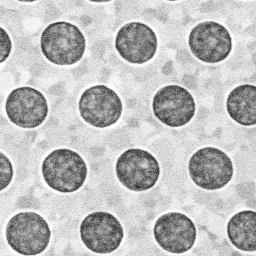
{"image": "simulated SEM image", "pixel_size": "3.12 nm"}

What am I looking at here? a regular array of holes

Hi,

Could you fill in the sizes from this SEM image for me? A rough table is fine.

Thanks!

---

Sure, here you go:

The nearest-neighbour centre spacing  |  228 nm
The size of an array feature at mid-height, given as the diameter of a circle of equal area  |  0.139 µm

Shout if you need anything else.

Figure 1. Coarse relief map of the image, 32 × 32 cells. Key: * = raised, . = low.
********************************
********************************
********************************
******....*****....*****....****
.****......***......****.....***
..***......***......****.....***
.****......****.....****.....***
.*****....*****....******...****
********************************
********************************
******************************.*
*....*****....******....*****...
*.....****.....****.....****....
*.....****.....****.....****....
*.....****.....****.....*****...
**...******...******...*******..
********************************
********************************
*************************..*****
.*****....*****....*****.....***
..***......***......****.....***
..***......***......****.....***
.****......****.....****.....***
.*****....******...******...****
********************************
********************************
**..********.********.********..
*.....****.....*****....*****...
*.....****.....****......***....
*.....****.....****......***....
*.....****.....*****....*****...
**...*******..*******..********.